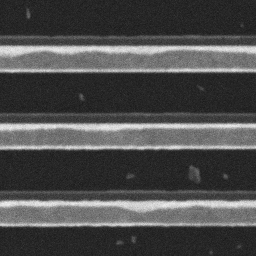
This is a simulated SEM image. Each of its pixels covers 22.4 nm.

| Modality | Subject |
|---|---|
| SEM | lines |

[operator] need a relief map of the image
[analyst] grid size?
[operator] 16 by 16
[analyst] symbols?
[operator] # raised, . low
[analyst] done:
................
................
################
################
#.#.............
................
................
################
################
................
................
................
################
################
................
................